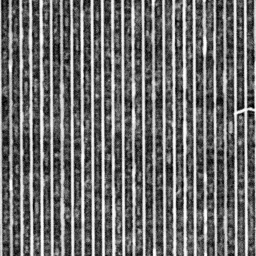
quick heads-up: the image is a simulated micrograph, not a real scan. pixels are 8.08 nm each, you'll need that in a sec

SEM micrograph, parallel lines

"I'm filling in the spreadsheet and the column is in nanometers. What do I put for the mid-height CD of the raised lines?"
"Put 15.1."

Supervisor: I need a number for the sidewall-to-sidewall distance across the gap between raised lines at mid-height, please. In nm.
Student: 70.7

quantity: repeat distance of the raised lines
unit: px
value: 10.2